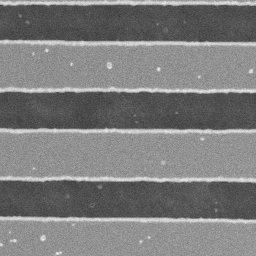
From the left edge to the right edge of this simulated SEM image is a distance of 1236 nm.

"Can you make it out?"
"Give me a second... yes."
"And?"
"lines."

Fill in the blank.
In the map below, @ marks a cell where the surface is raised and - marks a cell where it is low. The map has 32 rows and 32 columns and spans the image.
@@@@@@@@@@@@@@@@@@@@@@@@@@@@@@@@
--------------------------------
--------------------------------
--------------------------------
--------------------------------
@@@@@@@@@@@@@@@@@@@@@@@@@@@@@@@@
@@@@@@@@@@@@@@@@@@@@@@@@@@@@@@@@
@@@@@@@@@@@@@@@@@@@@@@@@@@@@@@@@
@@@@@@@@@@@@@@@@@@@@@@@@@@@@@@@@
@@@@@@@@@@@@@@@@@@@@@@@@@@@@@@@@
@@@@@@@@@@@@@@@@@@@@@@@@@@@@@@@@
@--@@@@@-@-----@@@@@@@@@@@@@@@@@
--------------------------------
--------------------------------
--------------------------------
--------------------------------
@@@@@@@@@@@@@@@@@@@@@@@@@@@@@@@@
@@@@@@@@@@@@@@@@@@@@@@@@@@@@@@@@
@@@@@@@@@@@@@@@@@@@@@@@@@@@@@@@@
@@@@@@@@@@@@@@@@@@@@@@@@@@@@@@@@
@@@@@@@@@@@@@@@@@@@@@@@@@@@@@@@@
@@@@@@@@@@@@@@@@@@@@@@@@@@@@@@@@
---@@@---@@@@@@@@@@@@@@@@@@@@@@@
--------------------------------
--------------------------------
--------------------------------
--------------------------------
@@@@@@@@@@@@@@@@@@@@@@@@@@@@@---
@@@@@@@@@@@@@@@@@@@@@@@@@@@@@@@@
@@@@@@@@@@@@@@@@@@@@@@@@@@@@@@@@
@@@@@@@@@@@@@@@@@@@@@@@@@@@@@@@@
@@@@@@@@@@@@@@@@@@@@@@@@@@@@@@@@